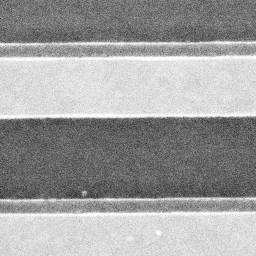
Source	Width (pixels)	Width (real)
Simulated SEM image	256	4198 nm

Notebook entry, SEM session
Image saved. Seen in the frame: lines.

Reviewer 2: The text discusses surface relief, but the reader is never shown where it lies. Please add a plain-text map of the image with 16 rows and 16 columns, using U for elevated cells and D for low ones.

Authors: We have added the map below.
DDDDDDDDDDDDDDDD
DDDDDDDDDDDDDDDD
DDDDDDDDDDDDDDDD
UUUUUUUUUUUUUUUU
UUUUUUUUUUUUUUUU
UUUUUUUUUUUUUUUU
UUUUUUUUUUUUUUUU
DDDDDDDDDDDDDDDD
DDDDDDDDDDDDDDDD
DDDDDDDDDDDDDDDD
DDDDDDDDDDDDDDDD
DDDDDDDDDDDDDDDD
DDDDDDDDDUUUUUUU
UUUUUUUUUUUUUUUU
UUUUUUUUUUUUUUUU
UUUUUUUUUUUUUUUU